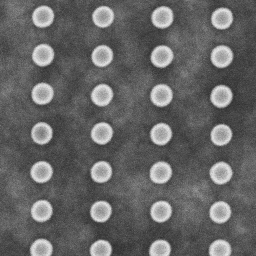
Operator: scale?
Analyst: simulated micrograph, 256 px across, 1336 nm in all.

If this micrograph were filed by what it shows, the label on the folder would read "a regular array of raised bodies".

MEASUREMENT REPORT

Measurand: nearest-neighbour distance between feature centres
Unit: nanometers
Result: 201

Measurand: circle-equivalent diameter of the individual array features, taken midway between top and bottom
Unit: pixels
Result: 20.4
